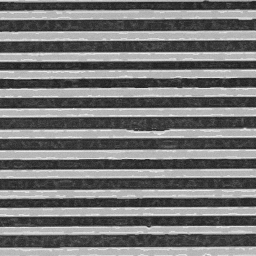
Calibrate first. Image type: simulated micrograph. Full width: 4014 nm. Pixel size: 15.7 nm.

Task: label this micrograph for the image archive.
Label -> parallel lines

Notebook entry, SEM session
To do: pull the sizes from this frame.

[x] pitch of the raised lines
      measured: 307 nm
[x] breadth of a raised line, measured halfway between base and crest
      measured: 8.37 px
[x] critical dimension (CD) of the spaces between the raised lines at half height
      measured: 188 nm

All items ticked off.